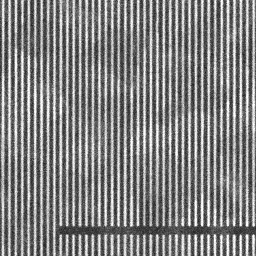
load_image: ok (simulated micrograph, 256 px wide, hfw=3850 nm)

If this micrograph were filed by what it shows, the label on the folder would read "parallel lines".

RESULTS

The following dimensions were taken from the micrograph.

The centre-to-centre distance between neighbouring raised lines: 96.5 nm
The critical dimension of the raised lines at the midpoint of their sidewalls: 20.7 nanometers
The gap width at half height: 4.87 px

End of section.